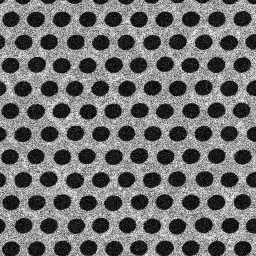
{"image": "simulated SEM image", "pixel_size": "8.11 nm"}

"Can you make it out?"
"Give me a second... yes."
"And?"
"a regular array of holes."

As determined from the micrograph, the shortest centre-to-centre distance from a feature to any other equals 205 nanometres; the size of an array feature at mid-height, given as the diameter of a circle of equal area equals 0.135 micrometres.